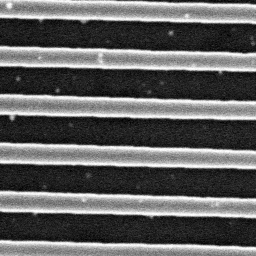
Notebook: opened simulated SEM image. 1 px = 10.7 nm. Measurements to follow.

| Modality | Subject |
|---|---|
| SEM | lines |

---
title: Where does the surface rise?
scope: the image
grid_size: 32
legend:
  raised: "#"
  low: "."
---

##########################......
################################
.................###############
................................
................................
................................
###################.............
################################
..................##############
................................
................................
................................
####################............
################################
............####################
................................
................................
................................
###################.............
################################
..........######################
................................
................................
................................
#################...............
################################
....############################
................................
................................
................................
#############...................
################################